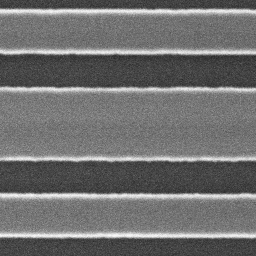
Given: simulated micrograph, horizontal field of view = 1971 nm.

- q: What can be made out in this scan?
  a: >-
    lines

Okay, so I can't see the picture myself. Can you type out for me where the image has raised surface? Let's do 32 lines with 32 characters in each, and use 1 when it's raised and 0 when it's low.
00000000000000000000000000000000
11111111111111111111111111111111
11111111111111111111111111111111
11111111111111111111111111111111
11111111111111111111111111111111
11111111111111111111111111111111
11111111111111111111111111111111
00000000000000000000000000000000
00000000000000000000000000000000
00000000000000000000000000000000
00000000000000000000000000000000
11111111111111111111111111111111
11111111111111111111111111111111
11111111111111111111111111111111
11111111111111111111111111111111
11111111111111111111111111111111
11111111111111111111111111111111
11111111111111111111111111111111
11111111111111111111111111111111
11111111111111111111111111111111
00000000000000000000000000000000
00000000000000000000000000000000
00000000000000000000000000000000
00000000000000000000000000000000
11111111111111111111111111111111
11111111111111111111111111111111
11111111111111111111111111111111
11111111111111111111111111111111
11111111111111111111111111111111
11111111111111111111111111111111
00000000000000000000000000000000
00000000000000000000000000000000